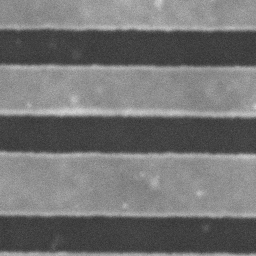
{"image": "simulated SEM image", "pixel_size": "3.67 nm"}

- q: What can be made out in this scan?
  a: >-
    lines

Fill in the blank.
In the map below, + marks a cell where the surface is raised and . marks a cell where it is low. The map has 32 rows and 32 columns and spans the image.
++++++++++++++++++++++++++++++++
++++++++++++++++++++++++++++++++
++++++++++++++++++++++++++++++++
++++++++++++++++++++++++++++++++
................................
................................
................................
................................
++++++++++++++++++++++++++++++++
++++++++++++++++++++++++++++++++
++++++++++++++++++++++++++++++++
++++++++++++++++++++++++++++++++
++++++++++++++++++++++++++++++++
++++++++++++++++++++++++++++++++
........................++++++++
................................
................................
................................
................................
++++++++++++++++++++++++++++++++
++++++++++++++++++++++++++++++++
++++++++++++++++++++++++++++++++
++++++++++++++++++++++++++++++++
++++++++++++++++++++++++++++++++
++++++++++++++++++++++++++++++++
++++++++++++++++++++++++++++++++
++++++++++++++++++++++++++++++++
................................
................................
................................
................................
................................